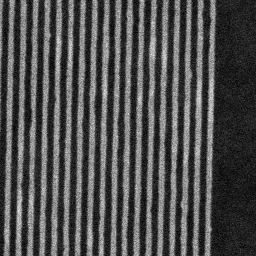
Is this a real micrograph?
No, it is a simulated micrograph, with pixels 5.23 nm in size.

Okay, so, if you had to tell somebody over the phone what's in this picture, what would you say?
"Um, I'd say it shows parallel lines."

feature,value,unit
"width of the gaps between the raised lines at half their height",7.5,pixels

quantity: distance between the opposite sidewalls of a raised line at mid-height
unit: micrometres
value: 0.0242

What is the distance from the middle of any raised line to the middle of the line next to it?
61.9 nanometers